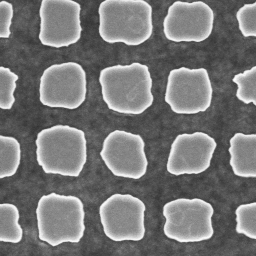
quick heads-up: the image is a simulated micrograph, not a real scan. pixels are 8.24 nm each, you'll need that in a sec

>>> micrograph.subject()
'a regular array of raised bodies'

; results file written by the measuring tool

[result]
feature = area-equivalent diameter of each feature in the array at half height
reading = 391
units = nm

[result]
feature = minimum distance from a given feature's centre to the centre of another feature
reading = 520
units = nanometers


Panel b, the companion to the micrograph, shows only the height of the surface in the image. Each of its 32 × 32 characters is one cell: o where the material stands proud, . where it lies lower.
o....ooooo...ooooo....oooo.....o
oo...ooooo..ooooooo..oooooo...oo
o....ooooo...oooooo..oooooo...oo
o....ooooo..ooooooo.oooooo....oo
o....ooooo...oooooo..ooooo......
......ooo.......o...............
................................
................................
o.....oooo...ooooo..............
oo...oooooo..oooooo..ooooo....oo
oo...oooooo..oooooo..ooooo....oo
oo...oooooo..oooooo..ooooo....oo
oo...oooooo..oooooo..ooooo....oo
o.............oooo....oooo......
................................
................................
.....ooooo....oo................
oo...oooooo..ooooo....ooooo..ooo
oo...oooooo..ooooo...oooooo..ooo
oo...oooooo..ooooo...ooooo...ooo
oo...ooooo...ooooo...ooooo...ooo
oo....oooo....oooo...oooo....ooo
................................
................................
......oo......ooo...............
o....ooooo...ooooo...ooooo.....o
oo...ooooo...ooooo..ooooooo...oo
oo...ooooo...ooooo...ooooo....oo
ooo..ooooo...ooooo..oooooo....oo
ooo..ooooo...ooooo...ooooo.....o
......o.........................
................................